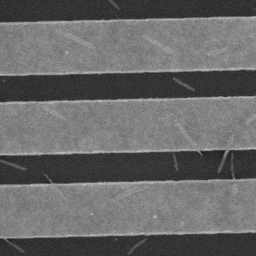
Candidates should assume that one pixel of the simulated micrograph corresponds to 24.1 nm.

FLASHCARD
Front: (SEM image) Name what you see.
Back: lines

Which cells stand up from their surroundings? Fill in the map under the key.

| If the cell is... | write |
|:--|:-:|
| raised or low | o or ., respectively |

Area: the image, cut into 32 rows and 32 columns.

................................
................................
..............oooooooooooooooooo
oooooooooooooooooooooooooooooooo
oooooooooooooooooooooooooooooooo
oooooooooooooooooooooooooooooooo
oooooooooooooooooooooooooooooooo
oooooooooooooooooooooooooooooooo
oooooooooooooooooooooooooooooooo
................................
................................
................................
...............ooooooooooooooooo
oooooooooooooooooooooooooooooooo
oooooooooooooooooooooooooooooooo
oooooooooooooooooooooooooooooooo
oooooooooooooooooooooooooooooooo
oooooooooooooooooooooooooooooooo
oooooooooooooooooooooooooooooooo
................................
................................
................................
..........................oooooo
oooooooooooooooooooooooooooooooo
oooooooooooooooooooooooooooooooo
oooooooooooooooooooooooooooooooo
oooooooooooooooooooooooooooooooo
oooooooooooooooooooooooooooooooo
oooooooooooooooooooooooooooooooo
ooooooooooooo...................
................................
................................